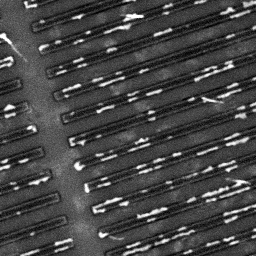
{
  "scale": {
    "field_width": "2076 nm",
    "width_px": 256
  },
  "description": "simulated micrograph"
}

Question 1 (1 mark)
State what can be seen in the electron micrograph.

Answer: parallel lines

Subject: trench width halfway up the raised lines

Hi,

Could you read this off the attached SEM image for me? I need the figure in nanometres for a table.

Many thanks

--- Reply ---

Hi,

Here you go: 134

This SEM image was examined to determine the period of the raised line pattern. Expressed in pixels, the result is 24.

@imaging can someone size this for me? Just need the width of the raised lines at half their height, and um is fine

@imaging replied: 0.0636